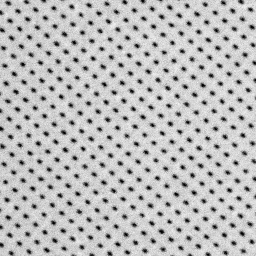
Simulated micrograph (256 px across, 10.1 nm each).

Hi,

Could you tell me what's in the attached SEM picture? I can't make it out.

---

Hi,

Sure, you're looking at a regular array of holes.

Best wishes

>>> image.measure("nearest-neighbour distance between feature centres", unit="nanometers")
125